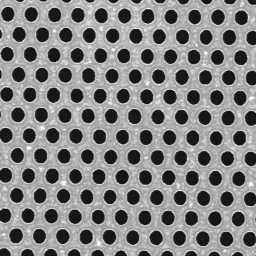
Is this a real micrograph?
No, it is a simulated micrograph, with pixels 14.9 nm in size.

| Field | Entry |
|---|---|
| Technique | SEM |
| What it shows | a regular array of holes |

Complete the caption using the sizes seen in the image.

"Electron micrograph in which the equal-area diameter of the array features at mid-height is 211 nanometres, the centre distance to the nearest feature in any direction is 342 nm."